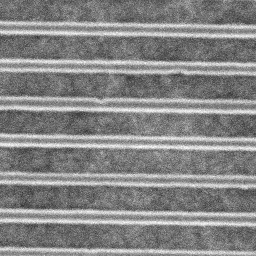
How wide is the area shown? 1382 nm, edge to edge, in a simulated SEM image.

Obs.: parallel lines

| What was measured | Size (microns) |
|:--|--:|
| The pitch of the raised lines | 0.203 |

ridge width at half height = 60.1 nanometers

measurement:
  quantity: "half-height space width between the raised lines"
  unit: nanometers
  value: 145